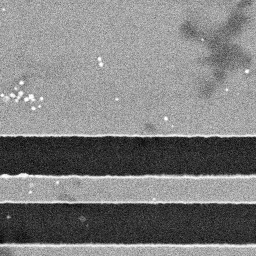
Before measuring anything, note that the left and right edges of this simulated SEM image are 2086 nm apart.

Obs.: lines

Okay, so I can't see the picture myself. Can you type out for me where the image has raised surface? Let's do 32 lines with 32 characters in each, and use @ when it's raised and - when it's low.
@@@@@@@@@@@@@@@@@@@@@@@@@@@@@@@@
@@@@@@@@@@@@@@@@@@@@@@@@@@@@@@@@
@@@@@@@@@@@@@@@@@@@@@@@@@@@@@@@@
@@@@@@@@@@@@@@@@@@@@@@@@@@@@@@@@
@@@@@@@@@@@@@@@@@@@@@@@@@@@@@@@@
@@@@@@@@@@@@@@@@@@@@@@@@@@@@@@@@
@@@@@@@@@@@@@@@@@@@@@@@@@@@@@@@@
@@@@@@@@@@@@@@@@@@@@@@@@@@@@@@@@
@@@@@@@@@@@@@@@@@@@@@@@@@@@@@@@@
@@@@@@@@@@@@@@@@@@@@@@@@@@@@@@@@
@@@@@@@@@@@@@@@@@@@@@@@@@@@@@@@@
@@@@@@@@@@@@@@@@@@@@@@@@@@@@@@@@
@@@@@@@@@@@@@@@@@@@@@@@@@@@@@@@@
@@@@@@@@@@@@@@@@@@@@@@@@@@@@@@@@
@@@@@@@@@@@@@@@@@@@@@@@@@@@@@@@@
@@@@@@@@@@@@@@@@@@@@@@@@@@@@@@@@
@@@@@@@@@@@@@@@@@@@@@@@@@@@@@@@@
--------------------------------
--------------------------------
--------------------------------
--------------------------------
--------------------------------
@@@@@@@@@@@@@@@@@@@@@@@@@@@@@@@@
@@@@@@@@@@@@@@@@@@@@@@@@@@@@@@@@
@@@@@@@@@@@@@@@@@@@@@@@@@@@@@@@@
--------------------------------
--------------------------------
--------------------------------
--------------------------------
--------------------------------
--------------------------------
@@@@@@@@@@@@@@@@@@@@@@@@@@@@@@@@